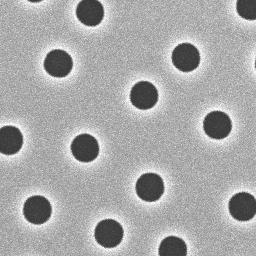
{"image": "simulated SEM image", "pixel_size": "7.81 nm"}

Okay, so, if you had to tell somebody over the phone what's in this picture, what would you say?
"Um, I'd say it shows a regular array of holes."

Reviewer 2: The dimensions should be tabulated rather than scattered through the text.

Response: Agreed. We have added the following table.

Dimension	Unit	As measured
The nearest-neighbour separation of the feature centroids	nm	532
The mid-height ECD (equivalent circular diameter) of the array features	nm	233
